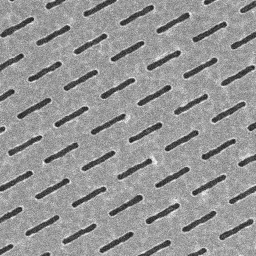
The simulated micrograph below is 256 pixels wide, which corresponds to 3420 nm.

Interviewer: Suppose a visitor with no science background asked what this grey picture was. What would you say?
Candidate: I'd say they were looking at a regular array of holes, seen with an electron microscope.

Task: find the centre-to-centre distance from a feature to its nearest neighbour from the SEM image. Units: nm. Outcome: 497